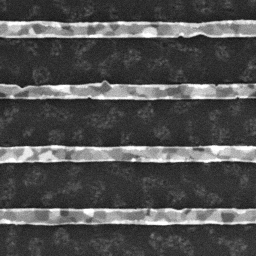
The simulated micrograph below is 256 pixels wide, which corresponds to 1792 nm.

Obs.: one or a few lines or trenches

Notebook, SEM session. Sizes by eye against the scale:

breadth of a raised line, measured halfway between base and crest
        0.103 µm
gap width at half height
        0.338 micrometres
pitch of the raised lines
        436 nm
